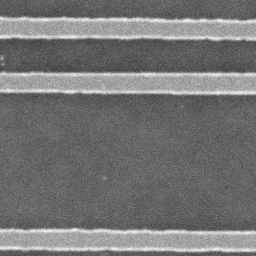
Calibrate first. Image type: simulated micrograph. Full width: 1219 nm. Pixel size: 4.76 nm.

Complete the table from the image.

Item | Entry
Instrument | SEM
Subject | lines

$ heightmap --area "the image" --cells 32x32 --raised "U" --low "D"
DDDDDDDDDDDDDDDDDDDDDDDDDDDDDDDD
DDDDDDDDDDDDDDDDDDDDDDDDDDDDDDDD
UUUUUUUUUUUUUUUUUUUUUDDUDUDUDDDD
UUUUUUUUUUUUUUUUUUUUUUUUUUUUUUUU
UUUUUUUUUUUUUUUUUUUUUUUUUUUUUUUU
DDDDDDDDDDDDDDDDDDDDDDDDDDDDDDDD
DDDDDDDDDDDDDDDDDDDDDDDDDDDDDDDD
DDDDDDDDDDDDDDDDDDDDDDDDDDDDDDDD
DDDDDDDDDDDDDDDDDDDDDDDDDDDDDDDD
UUUUUUUUUUUUUUUUUUUUUUUUUUUUUUUU
UUUUUUUUUUUUUUUUUUUUUUUUUUUUUUUU
DDDDDDDDUUUUUUUUUUUUUUUUUUUUUUUU
DDDDDDDDDDDDDDDDDDDDDDDDDDDDDDDD
DDDDDDDDDDDDDDDDDDDDDDDDDDDDDDDD
DDDDDDDDDDDDDDDDDDDDDDDDDDDDDDDD
DDDDDDDDDDDDDDDDDDDDDDDDDDDDDDDD
DDDDDDDDDDDDDDDDDDDDDDDDDDDDDDDD
DDDDDDDDDDDDDDDDDDDDDDDDDDDDDDDD
DDDDDDDDDDDDDDDDDDDDDDDDDDDDDDDD
DDDDDDDDDDDDDDDDDDDDDDDDDDDDDDDD
DDDDDDDDDDDDDDDDDDDDDDDDDDDDDDDD
DDDDDDDDDDDDDDDDDDDDDDDDDDDDDDDD
DDDDDDDDDDDDDDDDDDDDDDDDDDDDDDDD
DDDDDDDDDDDDDDDDDDDDDDDDDDDDDDDD
DDDDDDDDDDDDDDDDDDDDDDDDDDDDDDDD
DDDDDDDDDDDDDDDDDDDDDDDDDDDDDDDD
DDDDDDDDDDDDDDDDDDDDDDDDDDDDDDDD
DDDDDDDDDDDDDDDDDDDDDDDDDDDDDDDD
DDDDDDDDDDDDDDDDDDDDDDDDDDDDDDDD
UUUUUUUUUUUUUUUUUUUUUUUUUUUUUUUU
UUUUUUUUUUUUUUUUUUUUUUUUUUUUUUUU
DDDDDDDDDDDDDDDDDDDDDDDDDDDDDDDD